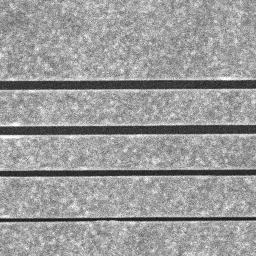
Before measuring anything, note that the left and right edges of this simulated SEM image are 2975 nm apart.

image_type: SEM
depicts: parallel lines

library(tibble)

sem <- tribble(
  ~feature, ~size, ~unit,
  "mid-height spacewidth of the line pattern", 0.102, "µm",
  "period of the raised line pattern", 519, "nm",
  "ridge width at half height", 429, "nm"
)